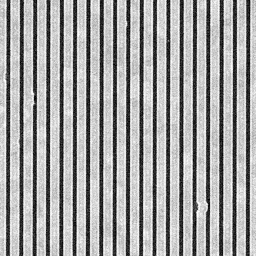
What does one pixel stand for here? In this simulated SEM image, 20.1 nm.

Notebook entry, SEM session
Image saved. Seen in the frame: parallel lines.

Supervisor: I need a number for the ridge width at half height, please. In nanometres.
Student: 154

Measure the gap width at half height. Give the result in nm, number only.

116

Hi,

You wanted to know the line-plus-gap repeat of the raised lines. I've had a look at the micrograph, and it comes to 268 nanometers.